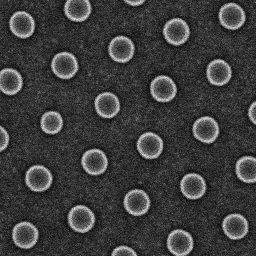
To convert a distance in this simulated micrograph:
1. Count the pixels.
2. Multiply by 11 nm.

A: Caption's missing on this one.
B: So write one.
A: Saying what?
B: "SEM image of a regular array of raised bodies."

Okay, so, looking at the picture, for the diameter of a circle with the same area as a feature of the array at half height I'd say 265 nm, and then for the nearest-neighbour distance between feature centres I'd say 0.632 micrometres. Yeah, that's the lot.